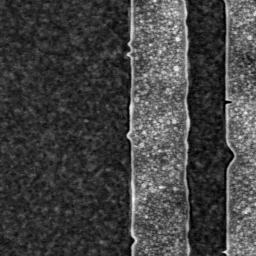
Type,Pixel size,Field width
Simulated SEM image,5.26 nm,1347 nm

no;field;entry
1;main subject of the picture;one or a few lines or trenches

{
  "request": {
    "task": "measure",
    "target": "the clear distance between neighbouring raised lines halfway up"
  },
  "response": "207 nm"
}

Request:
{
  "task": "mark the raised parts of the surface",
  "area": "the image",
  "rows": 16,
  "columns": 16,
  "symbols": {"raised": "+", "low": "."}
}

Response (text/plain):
........++++..++
........++++..++
........++++..++
........++++..++
........++++..++
........++++..++
........++++..++
........++++..++
........++++..++
........++++..++
........++++..++
........++++..++
........++++..++
........++++..++
........++++..++
........++++..++